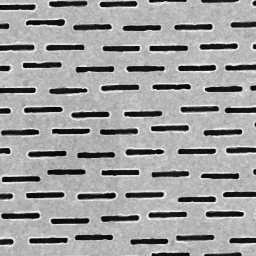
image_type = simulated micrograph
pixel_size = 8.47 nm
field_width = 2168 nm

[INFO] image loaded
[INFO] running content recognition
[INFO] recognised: a regular array of holes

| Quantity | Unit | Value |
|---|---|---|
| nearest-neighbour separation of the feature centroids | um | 0.259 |